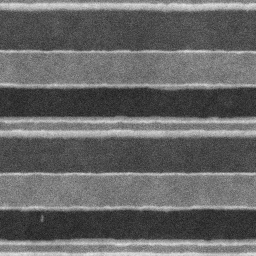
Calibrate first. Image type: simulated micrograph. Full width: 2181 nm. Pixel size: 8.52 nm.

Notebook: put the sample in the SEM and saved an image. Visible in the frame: lines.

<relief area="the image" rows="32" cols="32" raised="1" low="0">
11111111111111111111111111111111
00000000000000000000000000000000
00000000000000000000000000000000
00000000000000000000000000000000
00000000000000000000000000000000
00000000000000000000000000000000
11111111111111111111111111111111
11111111111111111111111111111111
11111111111111111111111111111111
11111111111111111111111111111111
11111111111111111111111111111111
00000000000000000000000000000000
00000000000000000000000000000000
00000000000000000000000000000000
00000000000000000000000000000000
11111111111111111111111111111111
11111111111111111111111111111111
00000000000000000000000000000000
00000000000000000000000000000000
00000000000000000000000000000000
00000000000000000000000000000000
00000000000000000000000000000000
11111111111111111111111111111111
11111111111111111111111111111111
11111111111111111111111111111111
11111111111111111111111111111111
00000000000000000000000000000000
00000000000000000000000000000000
00000000000000000000000000000000
00000000000000000000000000000000
11111111111111111111111111111111
11111111111111111111111111111111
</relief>